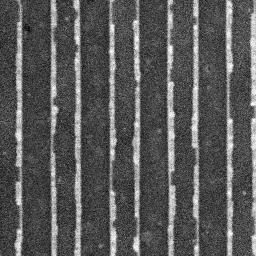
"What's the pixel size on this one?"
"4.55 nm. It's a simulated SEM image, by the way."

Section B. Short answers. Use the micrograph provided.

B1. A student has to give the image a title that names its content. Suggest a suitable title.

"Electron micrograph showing parallel lines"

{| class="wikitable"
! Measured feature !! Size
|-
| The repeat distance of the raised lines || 267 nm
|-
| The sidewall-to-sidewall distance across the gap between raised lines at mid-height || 136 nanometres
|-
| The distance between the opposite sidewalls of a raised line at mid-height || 28.8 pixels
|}